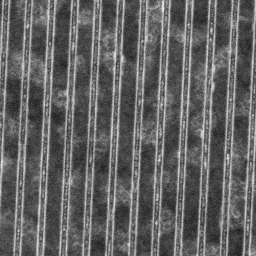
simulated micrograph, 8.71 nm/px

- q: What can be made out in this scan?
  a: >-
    parallel lines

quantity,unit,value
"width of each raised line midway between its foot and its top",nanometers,154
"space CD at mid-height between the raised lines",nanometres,47.9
